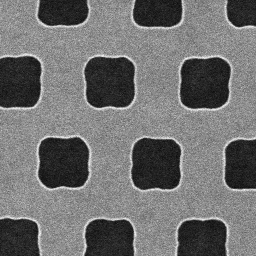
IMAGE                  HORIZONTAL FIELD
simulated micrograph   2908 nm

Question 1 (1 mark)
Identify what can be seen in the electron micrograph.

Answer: holes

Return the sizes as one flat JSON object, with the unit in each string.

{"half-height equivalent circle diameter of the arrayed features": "620 nm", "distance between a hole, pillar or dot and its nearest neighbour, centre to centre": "1050 nanometres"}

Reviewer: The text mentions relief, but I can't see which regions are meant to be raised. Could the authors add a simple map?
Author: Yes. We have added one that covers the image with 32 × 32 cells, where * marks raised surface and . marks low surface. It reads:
*****......******......*****....
*****......******......*****....
*****......******......******...
********************************
********************************
********************************
********************************
.....******.....*******.....****
.....******......******......***
.....******......******......***
.....******......******......***
.....******......*****.......***
.....******......******.....****
************.***********...*****
********************************
********************************
********************************
*****.....*******.....********.*
*****......******......*****....
*****......*****.......*****....
*****......*****.......*****....
*****......*****.......*****....
*****......*****......******....
******.**********.....*******...
********************************
********************************
********************************
....********..*.********.*.*****
.....******......*****......****
.....******......*****......****
.....******......*****......****
.....******......*****......****